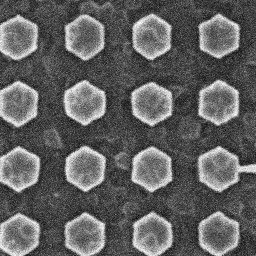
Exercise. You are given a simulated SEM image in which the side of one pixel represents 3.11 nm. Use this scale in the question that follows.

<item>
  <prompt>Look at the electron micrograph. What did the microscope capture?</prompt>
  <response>a regular array of raised bodies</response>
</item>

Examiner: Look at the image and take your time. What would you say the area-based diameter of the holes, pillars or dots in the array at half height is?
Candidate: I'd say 126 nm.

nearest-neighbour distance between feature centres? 65.7 pixels